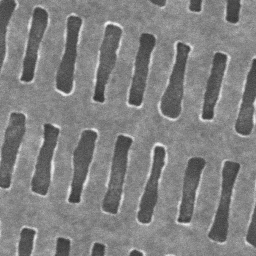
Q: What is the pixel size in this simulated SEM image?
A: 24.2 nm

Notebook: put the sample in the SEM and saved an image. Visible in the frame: a regular array of holes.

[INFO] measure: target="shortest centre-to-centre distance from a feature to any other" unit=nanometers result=895